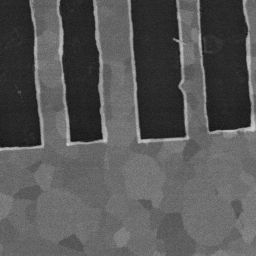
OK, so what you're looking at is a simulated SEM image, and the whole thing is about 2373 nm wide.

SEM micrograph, one or a few lines or trenches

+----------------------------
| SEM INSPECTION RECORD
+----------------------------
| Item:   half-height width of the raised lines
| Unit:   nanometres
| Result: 248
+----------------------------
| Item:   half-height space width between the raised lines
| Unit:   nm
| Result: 431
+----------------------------